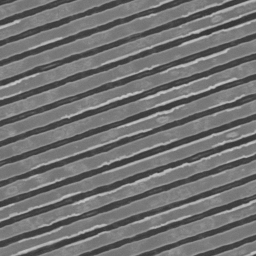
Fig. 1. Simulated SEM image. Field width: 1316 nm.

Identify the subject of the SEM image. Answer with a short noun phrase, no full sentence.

parallel lines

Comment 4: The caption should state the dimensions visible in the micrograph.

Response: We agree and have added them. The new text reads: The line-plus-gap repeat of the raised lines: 98 nanometres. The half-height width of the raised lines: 67.4 nanometers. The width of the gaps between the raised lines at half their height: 0.0291 um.